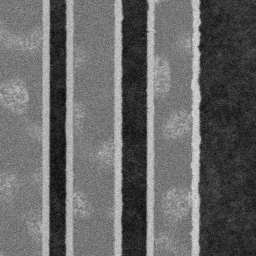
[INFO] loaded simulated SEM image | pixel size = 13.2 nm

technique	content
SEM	one or a few lines or trenches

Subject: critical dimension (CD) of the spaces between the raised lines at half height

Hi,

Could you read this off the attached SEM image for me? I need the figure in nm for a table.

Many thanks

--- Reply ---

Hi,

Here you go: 367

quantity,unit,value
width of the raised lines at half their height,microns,0.619